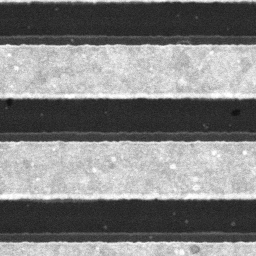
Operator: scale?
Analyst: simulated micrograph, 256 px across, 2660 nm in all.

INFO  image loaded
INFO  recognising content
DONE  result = lines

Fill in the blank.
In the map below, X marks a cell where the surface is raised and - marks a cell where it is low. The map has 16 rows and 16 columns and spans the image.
----------------
----------------
----------------
XXXXXXXXXXXXXXXX
XXXXXXXXXXXXXXXX
XXXXXXXXXXXXXXXX
----------------
----------------
----------------
XXXXXXXXXXXXXXXX
XXXXXXXXXXXXXXXX
XXXXXXXXXXXXXXXX
----------------
----------------
----------------
XXXXXXXXXXXXXXXX